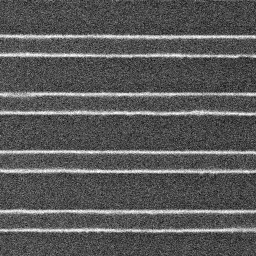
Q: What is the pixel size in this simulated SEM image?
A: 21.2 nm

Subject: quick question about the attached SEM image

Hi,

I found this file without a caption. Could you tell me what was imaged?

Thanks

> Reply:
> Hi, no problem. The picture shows lines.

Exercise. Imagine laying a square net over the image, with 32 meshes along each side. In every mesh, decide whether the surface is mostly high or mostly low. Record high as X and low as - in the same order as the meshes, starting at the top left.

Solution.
--------------------------------
--------------------------------
--------------------------------
--------------------------------
--------------------------------
XXXXXXXXXXXXXXXXXXXXXXXXXXXXXXXX
XXXXXXXXXXXXXXXXXXXXXXXXXXXXXXXX
--------------------------------
--------------------------------
--------------------------------
--------------------------------
--------------------------------
XXXXXXXXXXXXXXXXXXXXXXXXXXXXXXXX
XXXXXXXXXXXXXXXXXXXXXXXXXXXXXXXX
--------------------------------
--------------------------------
--------------------------------
--------------------------------
--------------------------------
XXXXXXXXXXXXXXXXXXXXXXXXXXXXXXXX
XXXXXXXXXXXXXXXXXXXXXXXXXXXXXXXX
-------------XX----X----------XX
--------------------------------
--------------------------------
--------------------------------
--------------------------------
XXXXXXXXXXXXXXXXXXXXXXXXXXXXXXXX
XXXXXXXXXXXXXXXXXXXXXXXXXXXXXXXX
XXXXXXXXXXXXXXXXXXXXXXXXXXXXXXXX
--------------------------------
--------------------------------
--------------------------------